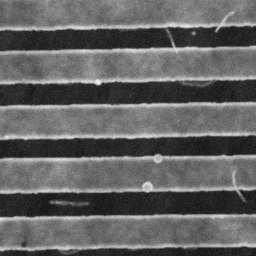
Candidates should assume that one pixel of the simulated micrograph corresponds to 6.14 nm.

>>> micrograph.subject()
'lines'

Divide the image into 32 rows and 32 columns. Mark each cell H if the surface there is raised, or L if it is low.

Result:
HHHHHHHHHHHHHHHHHHHHHHHHHHHHHHHH
HHHHHHHHHHHHHHHHHHHHHHHHHHHHHHHH
HHHHHHHHHHHHHHHHHHHHHHHHHHHHHHHH
HHHHHHHHHHHHHHHHHLLLLLLLLLLLLLLL
LLLLLLLLLLLLLLLLLLLLLLLLLLLLLLLL
LLLLLLLLLLLLLLLLLLLLLLLLLLLLLLLL
LLLLHHHHHHHHHHHHHHHHHHHHHHHHHHHH
HHHHHHHHHHHHHHHHHHHHHHHHHHHHHHHH
HHHHHHHHHHHHHHHHHHHHHHHHHHHHHHHH
HHHHHHHHHHHHHHHHHHHHHHHHHHHHHHHH
LLLLLLLLLLLLLLLLLLLLLLLLLLLLLLLL
LLLLLLLLLLLLLLLLLLLLLLLLLLLLLLLL
LLLLLLLLLLLLLLLLLLLLLLLLLLLLLLLL
HHHHHHHHHHHHHHHHHHHHHHHHHHHHHHHH
HHHHHHHHHHHHHHHHHHHHHHHHHHHHHHHH
HHHHHHHHHHHHHHHHHHHHHHHHHHHHHHHH
HHHHHHHHHHHHHHHHHHHHHHHHHHHHHHHH
LLLLLLLLLLLLLLLLLLLLLLLLLLLLLLLL
LLLLLLLLLLLLLLLLLLLLLLLLLLLLLLLL
LLLLLLLLLLLLLLLLLLLHLLLLLLLLLHHH
HHHHHHHHHHHHHHHHHHHHHHHHHHHHHHHH
HHHHHHHHHHHHHHHHHHHHHHHHHHHHHHHH
HHHHHHHHHHHHHHHHHHHHHHHHHHHHHHHH
HHHHHHHHHHHHHHHHHHHHHHHHHHHHHHHH
LLLLLLLLLLLLLLLLLLLLLLLLLLLLLLLL
LLLLLLLLLLLLLLLLLLLLLLLLLLLLLLLL
LLLLLLLLLLLLLLLLLLLLLLLLLLLLLLLL
HHHHHHHHHHHHHHHHHHHHHHHHHHHHHHHH
HHHHHHHHHHHHHHHHHHHHHHHHHHHHHHHH
HHHHHHHHHHHHHHHHHHHHHHHHHHHHHHHH
HHHHHHHHHHHHHHHHHHHHHHHHHHHHHHHH
LLLLLLLLLLLLLLLLLLLLLLLLLLLLLLLL